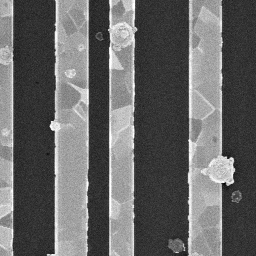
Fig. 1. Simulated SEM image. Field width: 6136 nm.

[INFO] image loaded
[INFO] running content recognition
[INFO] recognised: lines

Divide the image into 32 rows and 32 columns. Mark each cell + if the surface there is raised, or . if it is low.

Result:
+......++++...+++.......++++....
+......++++...+++.......++++....
+......++++...+++.......++++....
+......++++...+++.......++++....
+......++++...+++.......++++....
+......++++...+++.......++++....
++.....++++...+++.......++++....
+......++++...+++.......++++....
+......++++...+++.......++++....
+......++++...+++.......++++....
+......++++...+++.......++++....
+......++++...+++.......++++....
+......++++...+++.......++++....
+......++++...+++.......++++....
+......++++...+++.......++++....
+.....+++++...+++.......++++....
+......++++...+++.......++++....
+......++++...+++.......++++....
+......++++...+++.......++++....
+......++++...+++.......++++....
+......++++...+++.......+++++...
+......++++...+++.......+++++...
+......++++...+++.......+++++...
+......++++...+++.......++++....
+......++++...+++.......++++....
+......++++...+++.......++++....
+......++++...+++.......++++....
+......++++...+++.......++++....
+......++++...+++.......++++....
+......++++...+++.......++++....
+......++++...+++.....+.++++....
+......++++...+++.......++++....